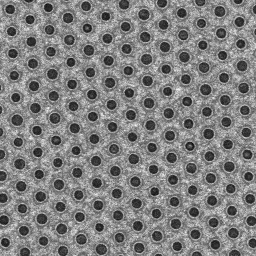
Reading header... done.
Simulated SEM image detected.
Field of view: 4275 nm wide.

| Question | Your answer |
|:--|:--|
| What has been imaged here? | a regular array of holes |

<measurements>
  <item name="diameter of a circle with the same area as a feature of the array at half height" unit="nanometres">172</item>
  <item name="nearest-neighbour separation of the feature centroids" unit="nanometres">362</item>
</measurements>